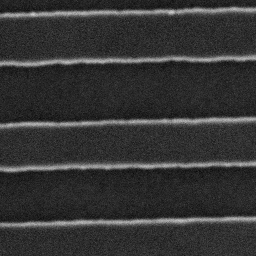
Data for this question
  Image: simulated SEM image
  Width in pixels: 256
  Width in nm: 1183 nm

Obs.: lines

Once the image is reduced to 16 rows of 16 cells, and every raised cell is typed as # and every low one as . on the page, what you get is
................
################
################
################
................
................
................
...........#####
################
################
#####...........
................
................
................
################
################